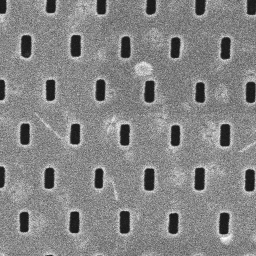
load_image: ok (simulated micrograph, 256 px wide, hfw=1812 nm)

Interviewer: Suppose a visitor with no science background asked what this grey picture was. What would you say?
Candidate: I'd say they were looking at a regular array of holes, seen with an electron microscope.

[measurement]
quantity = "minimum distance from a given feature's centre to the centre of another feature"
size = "351 nanometers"